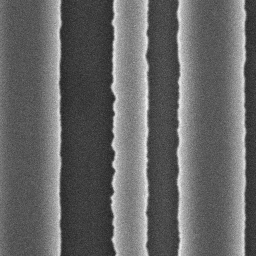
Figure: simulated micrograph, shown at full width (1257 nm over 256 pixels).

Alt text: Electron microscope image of lines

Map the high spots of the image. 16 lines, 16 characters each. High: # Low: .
####...########.
####...########.
####...########.
####...########.
####...########.
####...########.
####...########.
####...########.
####...########.
####...########.
####...########.
####...########.
####...########.
####...########.
####...########.
####...########.